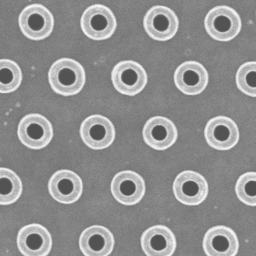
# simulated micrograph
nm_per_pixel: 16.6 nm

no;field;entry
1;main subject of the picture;a regular array of ring-shaped raised bodies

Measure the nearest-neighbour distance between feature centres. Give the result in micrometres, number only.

1.03